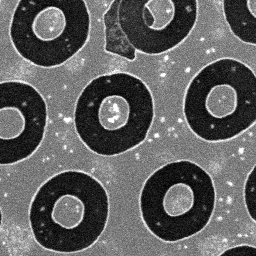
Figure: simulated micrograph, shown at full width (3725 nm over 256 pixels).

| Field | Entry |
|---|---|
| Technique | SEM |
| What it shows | ring-shaped grooves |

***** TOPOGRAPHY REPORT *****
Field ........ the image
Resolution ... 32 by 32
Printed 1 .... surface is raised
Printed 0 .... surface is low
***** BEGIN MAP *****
11000000000111000011110001110001
11000111000110000001110001110001
11001111000110000001100011110000
10001111000110000001000011111000
10000110000110000000000111111100
11000000000110000000001111111111
11000000001111000100111111111111
11100000111111111111111111100111
11111111111111111111111111000001
11111111111110000111111110000000
00011111111000000011111100000000
00000111110000000001111000111000
00000111110001110001111000111100
01000011100001110001111000111000
11100011100011110001111000010000
11100011100001110001111100000000
11100111110000000011111100000011
00000111110000000011111111001111
00000111111000001111111111111111
00001111111111111111111111111111
01111111111111111111100011111111
11111111001111111110000000111110
11111100000011111100000000111110
11111000000001111100011100011110
11110000100001111100011100011110
11110001110000111100111100011110
11110001110000111100011000011110
11110001110001111100000000111111
11110000100001111110000001111111
11110000000011111111000011111111
11111000000011111111111111111111
11111111011111111111111111110000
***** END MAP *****